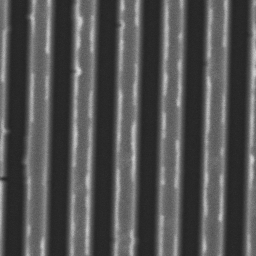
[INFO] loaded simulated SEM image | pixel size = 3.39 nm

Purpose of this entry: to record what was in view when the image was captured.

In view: parallel lines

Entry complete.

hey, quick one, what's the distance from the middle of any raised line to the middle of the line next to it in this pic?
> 150 nanometers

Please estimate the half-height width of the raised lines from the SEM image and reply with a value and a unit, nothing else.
78.8 nm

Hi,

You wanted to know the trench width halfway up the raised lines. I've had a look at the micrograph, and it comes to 72.9 nm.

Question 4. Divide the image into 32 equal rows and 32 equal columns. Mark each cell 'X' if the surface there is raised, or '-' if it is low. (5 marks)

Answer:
X---XXX--XXX---XXX--XXX---XXX--X
X---XXX--XXX---XXX--XXX---XXX--X
X---XX---XXX---XXX--XXX---XXX--X
X---XX---XXX---XXX--XXX---XXX--X
X---XX---XXX---XXX--XXX---XXX--X
X---XX---XXX---XXX--XXX---XXX--X
X---XX---XXX---XXX--XXX---XX---X
X---XX---XXX---XX---XXX---XX---X
X---XX---XXX---XX---XXX---XX---X
X---XX---XXX---XX---XXX---XX---X
X---XX---XXX---XX---XXX---XX---X
X---XX---XXX---XX---XXX---XX---X
X---XX---XXX---XX---XXX---XX---X
X---XX---XXX---XX---XXX---XX---X
X---XX---XXX--XXX---XXX--XXX---X
X--XXX---XXX--XXX---XXX--XXX---X
X--XXX---XXX--XXX---XXX--XXX---X
X--XXX---XXX--XXX---XXX--XXX---X
X--XXX---XXX--XXX---XXX--XXX---X
X--XXX---XXX--XXX---XXX--XXX---X
X--XXX---XXX--XXX---XXX--XXX---X
X--XXX---XXX--XXX---XXX--XXX---X
---XXX---XXX--XXX---XXX--XXX---X
---XXX---XX---XXX---XXX--XXX---X
---XXX---XX---XXX---XXX--XXX---X
---XXX---XX---XXX---XXX--XXX---X
---XXX---XX---XXX---XXX--XXX---X
---XXX---XX---XXX---XX---XXX---X
---XXX---XX---XXX---XX---XXX---X
---XXX---XX---XXX---XX---XXX---X
---XXX---XX---XXX---XX---XXX---X
---XXX---XX---XXX---XX---XXX---X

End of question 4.